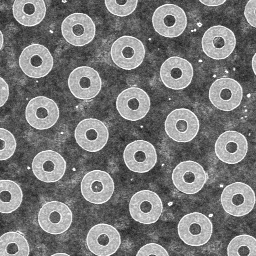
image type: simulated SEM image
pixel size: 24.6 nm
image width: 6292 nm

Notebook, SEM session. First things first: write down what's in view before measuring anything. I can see a regular array of ring-shaped raised bodies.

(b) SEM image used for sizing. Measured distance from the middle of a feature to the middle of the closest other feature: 1280 nm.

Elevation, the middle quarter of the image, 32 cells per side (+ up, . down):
..............++++......++++++++
...++++.................+++..+++
..++++++................+++...++
.+++..+++...............+++..+++
.+++...++................+++++++
.+++...++.................+++++.
..+++++++......+++++............
..++++++......++++++............
....+++......++++.+++...........
.............+++...++...........
.............+++...++...........
.............++++.+++.......+++.
..............++++++.......+++++
...............++++.......++++++
....+++++................+++...+
...+++++++...............+++...+
...+++..+++..............+++...+
...++....++...............++++++
...+++..+++................+++++
...++++++++......++++...........
....++++++......++++++..........
......+++......++++++++.........
...............+++..+++.........
...............+++...++.........
...............+++..+++........+
................++++++......++++
.................++++.......++++
......+++++................+++..
.....+++++++...............+++..
.....++..+++...............+++..
....+++...++................++++
....+++...++.................+++